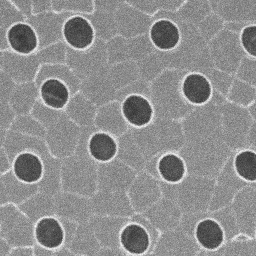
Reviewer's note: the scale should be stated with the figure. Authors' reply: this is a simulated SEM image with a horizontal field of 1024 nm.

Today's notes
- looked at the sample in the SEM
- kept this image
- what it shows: a regular array of holes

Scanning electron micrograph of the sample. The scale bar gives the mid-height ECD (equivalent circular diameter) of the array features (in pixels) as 30.1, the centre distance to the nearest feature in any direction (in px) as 63.2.